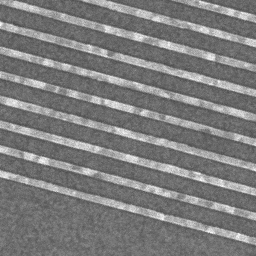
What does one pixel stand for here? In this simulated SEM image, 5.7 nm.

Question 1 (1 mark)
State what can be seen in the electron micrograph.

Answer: parallel lines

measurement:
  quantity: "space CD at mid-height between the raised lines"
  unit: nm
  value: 101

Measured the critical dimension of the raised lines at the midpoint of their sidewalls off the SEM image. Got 33.7 nm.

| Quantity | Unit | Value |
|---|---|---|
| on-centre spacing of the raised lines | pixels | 23.9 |